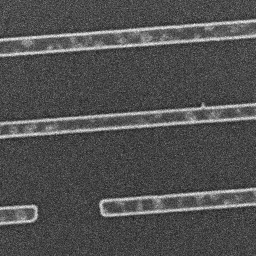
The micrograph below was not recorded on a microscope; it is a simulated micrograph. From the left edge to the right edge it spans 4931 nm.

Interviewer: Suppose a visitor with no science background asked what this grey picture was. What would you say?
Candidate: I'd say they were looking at one or a few lines or trenches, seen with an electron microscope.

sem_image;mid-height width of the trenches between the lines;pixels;68.3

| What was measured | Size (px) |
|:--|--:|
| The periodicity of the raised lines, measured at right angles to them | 83.5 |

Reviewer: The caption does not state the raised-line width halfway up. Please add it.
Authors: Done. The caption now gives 290 nanometres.